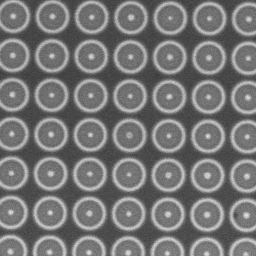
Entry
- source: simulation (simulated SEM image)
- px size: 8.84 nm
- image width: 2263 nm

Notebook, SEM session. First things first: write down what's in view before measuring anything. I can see an array of small figures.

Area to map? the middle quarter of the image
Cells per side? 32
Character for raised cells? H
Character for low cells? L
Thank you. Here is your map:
HHHHLLLLLLHHHHLLLLLHHHHHLLLLLHHH
HHHHHHLLHHHHHHHLLLHHHHHHHLLLLHHH
HHHHHHHHHHHHHHHHHHHHHHHHHHHHHHHH
HHHHHHHHHHHHHHHHHHHHHHHHHHHHHHHH
HHHHHHLLHHHHHHHLLLHHHHHHHHLHHHHH
HHHHLLLLLHHHHHLLLLLHHHHHLLLLLHHH
HHHLLLLLLLHHHLLLLLLLHHHLLLLLLLHH
LHHLLLLLLLHHHLLLLLLLHHHLLLLLLLHH
HHHLLLLLLLHHHLLLLLLLHHHLLLLLLLHH
HHHLLLLLLLHHHLLLLLLLHHHLLLLLLLHH
HHHHLLLLLHHHHHLLLLLHHHHLLLLLLHHH
HHHHHLLLHHHHHHHLLLHHHHHHHLLLHHHH
HHHHHHHHHHHHHHHHHHHHHHHHHHHHHHHH
HHHHHHHHHHHHHHHHHHHHHHHHHHHHHHHH
HHHHHLLLLHHHHHHLLLHHHHHHHLLHHHHH
HHHHLLLLLHHHHHLLLLLHHHHHLLLLLHHH
HHHLLLLLLLHHHLLLLLLLHHHLLLLLLLHH
LHHLLLLLLLHHHLLLHLLLHHHLLLLLLLHH
HHHLLLLLLLHHHLLLLLLLHHHLLLLLLLHH
HHHLLLLLLLHHHLLLLLLLHHHLLLLLLHHH
HHHHLLLLLHHHHHLLLLLHHHHHLLLLLHHH
HHHHHHLHHHHHHHHHLHHHHHHHHLLHHHHH
HHHHHHHHHHHHHHHHHHHHHHHHHHHHHHHH
HHHHHHHHHHHHHHHHHHHHHHHHHHHHHHHH
HHHHLLLLLHHHHHHLLLHHHHHHLLLLHHHH
HHHLLLLLLLHHHLLLLLLHHHHLLLLLLHHH
HHHLLLLLLLHHHLLLLLLLHHHLLLLLLHHH
LHHLLLLLLLHHLLLLLLLLHHLLLLLLLLHH
HHHLLLLLLLHHHLLLLLLLHHLLLLLLLLHH
HHHLLLLLLLHHHLLLLLLLHHHLLLLLLHHH
HHHHLLLLLHHHHHLLLLLHHHHHLLLLHHHH
HHHHHHHHHHHHHHHHHHHHHHHHHHHHHHHH